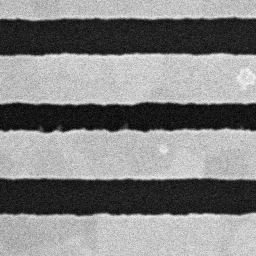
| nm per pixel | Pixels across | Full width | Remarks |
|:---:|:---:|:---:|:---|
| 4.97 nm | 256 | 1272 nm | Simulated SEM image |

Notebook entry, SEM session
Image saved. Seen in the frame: lines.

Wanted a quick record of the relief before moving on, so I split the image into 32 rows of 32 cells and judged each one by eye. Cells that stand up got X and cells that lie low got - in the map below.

XXXXXXXXXXXXXXXXXXXXXXXXXXXXXXXX
XXXXXXXXXXXXXXXXXXXXXXXXXXXXXXXX
--------------------------------
--------------------------------
--------------------------------
--------------------------------
--------------------------------
XXXXXXXXXXXXXXXXXXXXXXXXXXXXXXXX
XXXXXXXXXXXXXXXXXXXXXXXXXXXXXXXX
XXXXXXXXXXXXXXXXXXXXXXXXXXXXXXXX
XXXXXXXXXXXXXXXXXXXXXXXXXXXXXXXX
XXXXXXXXXXXXXXXXXXXXXXXXXXXXXXXX
XXXXXXXXXXXXXXXXXXXXXXXXXXXXXXXX
--------------------------------
--------------------------------
--------------------------------
XXXXX--XXXXXXXXXXXXXXXXXXXXXXXXX
XXXXXXXXXXXXXXXXXXXXXXXXXXXXXXXX
XXXXXXXXXXXXXXXXXXXXXXXXXXXXXXXX
XXXXXXXXXXXXXXXXXXXXXXXXXXXXXXXX
XXXXXXXXXXXXXXXXXXXXXXXXXXXXXXXX
XXXXXXXXXXXXXXXXXXXXXXXXXXXXXXXX
--------------------------------
--------------------------------
--------------------------------
--------------------------------
--------------------------------
XXXXXXXXXXXXXXXXXXXXXXXXXXXXXXXX
XXXXXXXXXXXXXXXXXXXXXXXXXXXXXXXX
XXXXXXXXXXXXXXXXXXXXXXXXXXXXXXXX
XXXXXXXXXXXXXXXXXXXXXXXXXXXXXXXX
XXXXXXXXXXXXXXXXXXXXXXXXXXXXXXXX